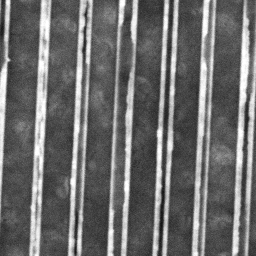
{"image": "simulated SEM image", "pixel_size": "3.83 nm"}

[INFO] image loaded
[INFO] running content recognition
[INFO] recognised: parallel lines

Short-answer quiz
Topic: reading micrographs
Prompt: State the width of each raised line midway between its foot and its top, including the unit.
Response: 47.4 nm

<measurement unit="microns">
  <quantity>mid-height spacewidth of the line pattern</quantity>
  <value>0.106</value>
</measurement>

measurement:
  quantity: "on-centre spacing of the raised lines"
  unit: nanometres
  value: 157